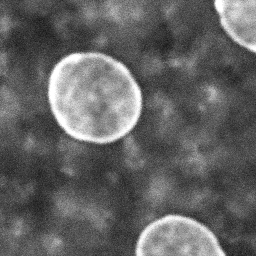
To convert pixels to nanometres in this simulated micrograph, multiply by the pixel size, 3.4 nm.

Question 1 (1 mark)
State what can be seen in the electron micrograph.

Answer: raised bodies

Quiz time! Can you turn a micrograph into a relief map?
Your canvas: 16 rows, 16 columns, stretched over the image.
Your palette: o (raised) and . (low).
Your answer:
..............oo
..............oo
...............o
.....oo.........
...ooooo........
...oooooo.......
...oooooo.......
....oooo........
.....ooo........
................
................
................
................
................
.........oooo...
.........ooooo..